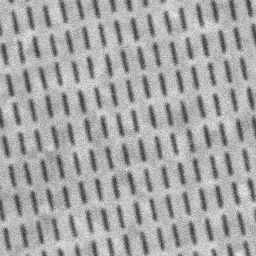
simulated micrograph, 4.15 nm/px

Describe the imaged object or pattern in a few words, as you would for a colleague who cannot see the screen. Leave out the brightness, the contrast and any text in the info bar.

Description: a regular array of holes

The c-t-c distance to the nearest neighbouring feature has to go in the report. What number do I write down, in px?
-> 16.2